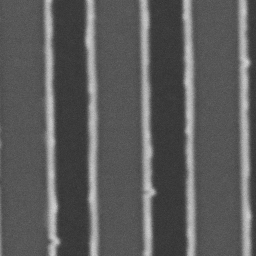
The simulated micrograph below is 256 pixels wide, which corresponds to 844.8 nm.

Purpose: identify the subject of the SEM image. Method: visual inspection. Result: one or a few lines or trenches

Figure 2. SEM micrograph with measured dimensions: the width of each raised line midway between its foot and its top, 0.15 microns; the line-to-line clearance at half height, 0.173 microns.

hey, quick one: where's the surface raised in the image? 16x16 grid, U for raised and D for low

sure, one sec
DDDUUUDDDUUUDDDU
DDDUUUDDDUUUDDDU
DDDUUUDDDUUUDDDU
DDDUUUDDDUUUDDDU
DDDUUUDDDUUUDDDU
DDDUUUDDDUUUDDDU
DDDUUUDDDUUUDDDU
DDDUUUDDDUUUDDDU
DDDUUUDDDUUUDDDU
DDDUUUDDDUUUDDDU
DDDUUUDDDUUUDDDU
DDDUUUDDDUUUDDDU
DDDUUUDDDUUUDDDU
DDDUUUDDDUUUDDDU
DDDUUUDDDUUUDDDU
DDDUUUDDDUUUDDDU